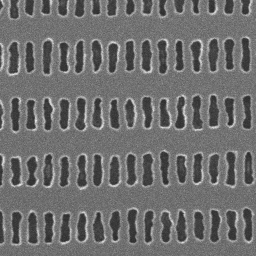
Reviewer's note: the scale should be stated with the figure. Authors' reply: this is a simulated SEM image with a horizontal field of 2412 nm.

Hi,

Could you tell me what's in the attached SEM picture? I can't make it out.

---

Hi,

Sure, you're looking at a regular array of holes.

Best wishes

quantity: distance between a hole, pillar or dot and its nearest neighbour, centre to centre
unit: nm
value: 153